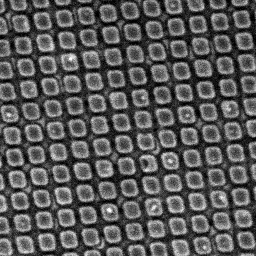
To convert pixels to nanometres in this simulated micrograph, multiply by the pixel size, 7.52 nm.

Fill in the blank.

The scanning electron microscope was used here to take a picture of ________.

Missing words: a regular array of raised bodies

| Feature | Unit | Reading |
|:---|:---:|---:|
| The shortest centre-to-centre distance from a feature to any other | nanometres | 164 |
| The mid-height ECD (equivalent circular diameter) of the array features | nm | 129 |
